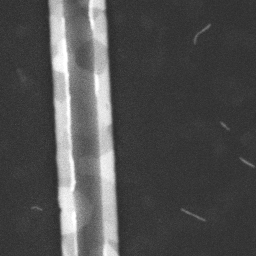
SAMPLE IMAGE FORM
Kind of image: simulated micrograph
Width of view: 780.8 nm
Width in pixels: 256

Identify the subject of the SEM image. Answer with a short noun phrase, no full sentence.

one or a few lines or trenches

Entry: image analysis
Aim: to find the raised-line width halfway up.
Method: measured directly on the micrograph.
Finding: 137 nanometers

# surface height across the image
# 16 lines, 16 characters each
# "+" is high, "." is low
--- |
...+++..........
....++..........
....++..........
....++..........
....++..........
....++..........
....+++.........
....+++.........
....+++.........
....+++.........
....+++.........
....+++.........
....+++.........
....+++.........
....+++.........
....+++.........